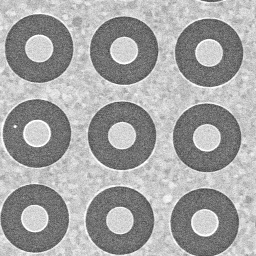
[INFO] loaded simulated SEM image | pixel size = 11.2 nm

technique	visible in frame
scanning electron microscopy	an array of small figures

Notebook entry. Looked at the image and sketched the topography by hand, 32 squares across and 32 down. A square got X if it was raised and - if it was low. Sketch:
XXXXXXXXXXXXXXXXXXXXXXXXXXXXXXXX
XXXXXXXXXXXXXXXXXXXXXXXXXXXXXXXX
XX-----XXXXXXX---XXXXXXXX--XXXXX
X-------XXXX-------XXXX------XXX
X--------XXX-------XXX--------XX
X--XXX---XX---XXX---XX---XX---XX
X--XXX---XX---XXX---XX---XXX--XX
X---XX---XX---XXX---XX---XX---XX
X-------XXXX-------XXX--------XX
XX-----XXXXXX-----XXXXX------XXX
XXXXXXXXXXXXXX---XXXXXXX----XXXX
XXXXXXXXXXXXXXXXXXXXXXXXXXXXXXXX
XXXX--XXXXXXXXXXXXXXXXXXXXXXXXXX
XX-----XXXXXX-----XXXXXX----XXXX
X-------XXXX-------XXX-------XXX
----XX---XX----X---XXX--------XX
---XXX---XX---XXX---XX--XXX---XX
---XXX---XX---XXX--XXX--XXX---XX
X--------XX----X---XXX---XX---XX
X-------XXXX-------XXX--------XX
XXX----XXXXXX-----XXXXX------XXX
XXXXXXXXXXXXXXXXXXXXXXXXX--XXXXX
XXXXXXXXXXXXXXXXXXXXXXXXXXXXXXXX
XX----XXXXXXX---XXXXXXXXX-XXXXXX
X-------XXXX------XXXXX-----XXXX
--------XXX--------XXX-------XXX
---XXX---XX---XX---XX----X----XX
---XXX---XX--XXXX--XX---XXX---XX
---XX----XX---XX---XX---XXX---XX
X-------XXX--------XXX--------XX
X------XXXXX------XXXX-------XXX
XXX--XXXXXXXX----XXXXXX-----XXXX